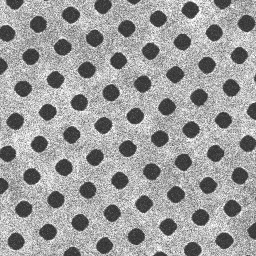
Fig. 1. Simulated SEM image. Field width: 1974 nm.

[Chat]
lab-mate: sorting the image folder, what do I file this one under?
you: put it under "a regular array of holes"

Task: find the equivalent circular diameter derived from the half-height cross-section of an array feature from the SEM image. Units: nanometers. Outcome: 130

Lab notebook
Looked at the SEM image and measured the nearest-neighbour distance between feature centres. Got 254 nm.